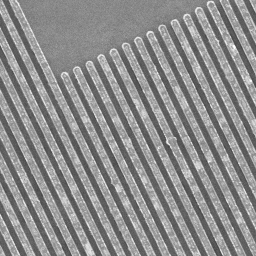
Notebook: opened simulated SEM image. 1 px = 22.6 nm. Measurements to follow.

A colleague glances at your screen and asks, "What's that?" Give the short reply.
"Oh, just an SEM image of parallel lines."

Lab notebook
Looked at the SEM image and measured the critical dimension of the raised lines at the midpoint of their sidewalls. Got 168 nm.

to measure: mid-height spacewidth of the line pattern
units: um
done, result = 0.147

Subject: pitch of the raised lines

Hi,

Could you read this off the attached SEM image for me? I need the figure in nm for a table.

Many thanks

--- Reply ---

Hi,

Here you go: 306